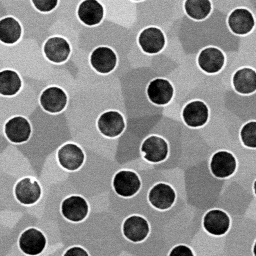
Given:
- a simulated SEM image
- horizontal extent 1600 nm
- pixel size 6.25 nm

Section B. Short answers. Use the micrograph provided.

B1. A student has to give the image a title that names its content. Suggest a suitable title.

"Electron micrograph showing a regular array of holes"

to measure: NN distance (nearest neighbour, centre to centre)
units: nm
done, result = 298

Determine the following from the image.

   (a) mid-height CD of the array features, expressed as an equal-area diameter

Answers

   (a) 0.169 um